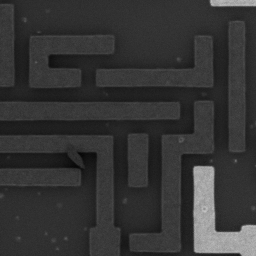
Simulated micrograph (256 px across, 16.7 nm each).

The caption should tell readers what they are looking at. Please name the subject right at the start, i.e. wiring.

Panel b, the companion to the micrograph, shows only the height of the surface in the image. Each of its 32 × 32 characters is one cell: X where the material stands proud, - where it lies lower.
--------------------------XXXXXX
XX------------------------------
XX------------------------------
XX---------------------------XX-
XX----------XX---------------XX-
XX--XXXXXXXXXX----------XX---XX-
XX--XXXXXXXXXX----------XXX--X--
XX--XX------------------XXX--X--
XX--XXX-----------------XXX--X--
XX--XXXXXX--XXXXXXXXXXXXXXX--X--
XX--XXXXXX--XXXXXXXXXXXXXXX--XX-
-----------------------------XX-
-----------------------------XX-
XXXXXXXXXXXXXXXXXXXXXX--XXX--XX-
XXXXXXXXXXXXXXXXXXXXXX--XXX--XX-
------------------------XXX--XX-
------------------------XXX--XX-
XXXXXXXXXXXXXX--XX--XXXXXXX--XX-
XXXXXXXXXXXXXX--XX--XXXXXXX--XX-
---------X--XX--XX--XXX---------
------------XX--XX--XXX---------
XXXXXXXXXX--XX--XX--XXX-XXX-----
XXXXXXXXXX--XX--XX--XXX-XXX-----
------------XX------XXX-XXX-----
------------XX------XXX-XXX-----
------------XX------XXX-XXX-----
------------XX------XX--XXX-----
------------XX------XX--XXX-----
------------XXX-----XX--XXX---XX
-----------XXXX-XXXXXX--XXXXXXXX
-----------XXXX-XXXXXXX-XXXXXXXX
-----------XXXX----------XXXXXXX